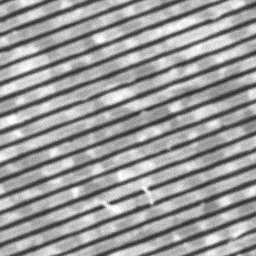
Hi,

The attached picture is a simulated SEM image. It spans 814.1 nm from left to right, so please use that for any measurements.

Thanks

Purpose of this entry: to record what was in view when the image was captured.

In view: parallel lines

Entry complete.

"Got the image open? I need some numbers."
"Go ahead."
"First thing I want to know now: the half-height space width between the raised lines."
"17.9 nm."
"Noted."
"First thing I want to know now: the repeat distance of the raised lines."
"48.1 nm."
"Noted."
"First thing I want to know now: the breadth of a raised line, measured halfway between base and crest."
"29.8 nm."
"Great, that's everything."